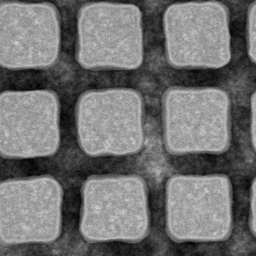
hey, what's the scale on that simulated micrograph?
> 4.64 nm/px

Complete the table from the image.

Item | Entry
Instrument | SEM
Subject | raised bodies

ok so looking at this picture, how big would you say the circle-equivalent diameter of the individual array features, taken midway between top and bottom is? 328 nm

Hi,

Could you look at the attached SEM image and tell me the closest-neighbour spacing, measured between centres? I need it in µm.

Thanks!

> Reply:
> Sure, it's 0.397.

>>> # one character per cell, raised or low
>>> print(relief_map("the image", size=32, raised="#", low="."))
######.....###.........####.....
#######...########...#######...#
#######...########...#######...#
#######...########...########..#
#######...########...########..#
#######...########...########..#
#######...########...########..#
#######...########...########...
.###...........##...............
................................
................................
...###.....######....#######....
#######...########...########..#
#######...########...########..#
#######...########...########...
#######...########...########..#
#######...########...########..#
#######...########...########...
#######...#######....#######....
.####...........................
................................
................................
...####....#######...#######....
########..########...########...
########..########...########...
########...#######...########..#
########..########...########..#
########..########...########..#
#######...########...########..#
#######....#######....######....
.#..............................
................................